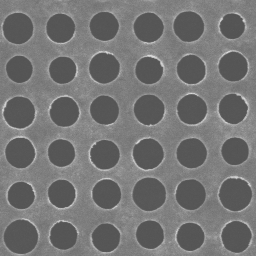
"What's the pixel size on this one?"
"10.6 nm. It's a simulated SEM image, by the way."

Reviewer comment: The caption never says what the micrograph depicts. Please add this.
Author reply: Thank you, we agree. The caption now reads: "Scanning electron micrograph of a regular array of holes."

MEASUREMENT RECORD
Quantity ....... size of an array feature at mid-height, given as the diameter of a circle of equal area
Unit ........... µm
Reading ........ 0.317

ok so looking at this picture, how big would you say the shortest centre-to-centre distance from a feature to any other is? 432 nanometers